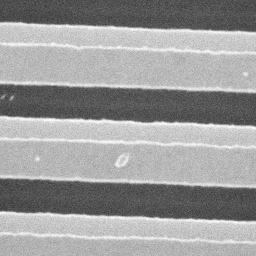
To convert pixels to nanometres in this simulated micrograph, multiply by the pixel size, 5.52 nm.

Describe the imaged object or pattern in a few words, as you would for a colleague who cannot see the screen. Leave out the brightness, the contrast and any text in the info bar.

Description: lines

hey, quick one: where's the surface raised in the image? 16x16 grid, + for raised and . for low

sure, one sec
................
++..............
++++++++++++++++
++++++++++++++++
++++++++++++++++
..........++++++
................
++++............
++++++++++++++++
++++++++++++++++
++++++++++++++++
...........+++++
................
+++++...........
++++++++++++++++
++++++++++++++++